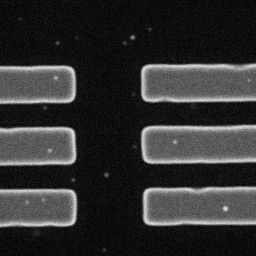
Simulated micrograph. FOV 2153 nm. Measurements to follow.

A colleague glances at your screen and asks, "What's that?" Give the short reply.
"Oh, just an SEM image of groups of lines, slits or small figures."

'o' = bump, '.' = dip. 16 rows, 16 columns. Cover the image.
................
................
................
................
ooooo....ooooooo
ooooo....ooooooo
................
................
ooooo....ooooooo
ooooo....ooooooo
................
................
ooooo....ooooooo
ooooo....ooooooo
................
................